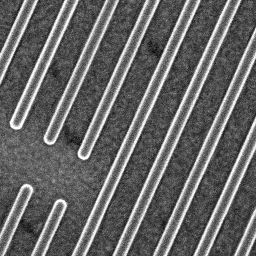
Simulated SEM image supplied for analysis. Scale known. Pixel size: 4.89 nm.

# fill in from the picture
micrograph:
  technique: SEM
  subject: parallel lines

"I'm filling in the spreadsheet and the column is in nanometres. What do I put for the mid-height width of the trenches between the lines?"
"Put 126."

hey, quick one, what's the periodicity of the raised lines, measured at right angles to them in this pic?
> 181 nanometers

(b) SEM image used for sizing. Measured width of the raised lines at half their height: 56.8 nanometers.